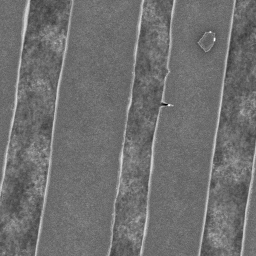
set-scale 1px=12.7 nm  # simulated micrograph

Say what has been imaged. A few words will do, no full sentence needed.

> one or a few lines or trenches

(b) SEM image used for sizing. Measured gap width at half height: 39.5 px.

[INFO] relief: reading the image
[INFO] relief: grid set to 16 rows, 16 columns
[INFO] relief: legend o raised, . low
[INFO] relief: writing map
oo..ooooo..oooo.
oo..ooooo..ooo..
o...ooooo..ooo..
o...ooooo..ooo..
o...oooo..oooo..
o...oooo..oooo..
o...oooo..oooo..
o..ooooo..oooo..
o..ooooo..ooo...
...ooooo..ooo...
...ooooo.oooo...
...oooo..oooo...
...oooo..oooo..o
...oooo..oooo..o
..ooooo..oooo..o
..ooooo..oooo..o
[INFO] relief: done